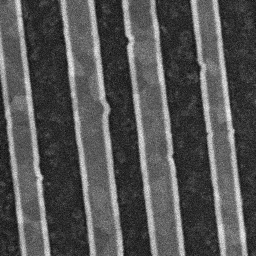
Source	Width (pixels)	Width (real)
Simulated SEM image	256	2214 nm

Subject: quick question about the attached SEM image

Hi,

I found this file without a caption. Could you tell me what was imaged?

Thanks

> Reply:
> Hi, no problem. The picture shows one or a few lines or trenches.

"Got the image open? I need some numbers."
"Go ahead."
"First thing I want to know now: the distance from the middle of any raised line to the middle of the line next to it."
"564 nm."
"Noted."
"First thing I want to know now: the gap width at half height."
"41.1 px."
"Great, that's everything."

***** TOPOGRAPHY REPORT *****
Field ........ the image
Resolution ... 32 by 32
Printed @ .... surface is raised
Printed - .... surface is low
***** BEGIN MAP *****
@@------@@@-----@@@-----@@@-----
@@------@@@@----@@@-----@@@-----
@@@-----@@@@----@@@------@@-----
@@@-----@@@@----@@@@-----@@-----
@@@-----@@@@----@@@@-----@@-----
@@@------@@@----@@@@-----@@@----
@@@------@@@----@@@@-----@@@----
@@@------@@@----@@@@-----@@@----
@@@------@@@-----@@@-----@@@----
@@@------@@@-----@@@-----@@@----
-@@------@@@@----@@@-----@@@----
-@@@-----@@@@----@@@------@@----
-@@@-----@@@@----@@@@-----@@----
-@@@-----@@@@----@@@@-----@@----
-@@@------@@@----@@@@-----@@@---
-@@@------@@@----@@@@-----@@@---
-@@@------@@@-----@@@-----@@@---
-@@@------@@@-----@@@-----@@@---
-@@@------@@@@----@@@-----@@@---
--@@@-----@@@@----@@@------@@---
--@@------@@@@----@@@------@@---
--@@@-----@@@@----@@@@-----@@---
--@@@------@@@----@@@@-----@@@--
--@@@------@@@----@@@@-----@@@--
--@@@------@@@----@@@@-----@@@--
--@@@------@@@-----@@@-----@@@--
--@@@------@@@-----@@@-----@@@--
---@@------@@@@----@@@-----@@@--
---@@@-----@@@@----@@@------@@--
---@@@-----@@@@----@@@@-----@@--
---@@@-----@@@@----@@@@-----@@--
---@@@------@@@----@@@@-----@@@-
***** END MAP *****